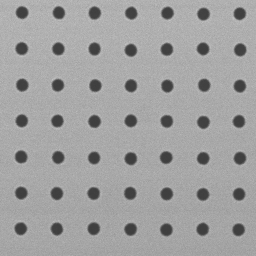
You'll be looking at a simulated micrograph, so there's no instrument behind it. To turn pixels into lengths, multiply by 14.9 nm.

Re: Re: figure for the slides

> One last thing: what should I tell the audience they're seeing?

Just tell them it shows a regular array of holes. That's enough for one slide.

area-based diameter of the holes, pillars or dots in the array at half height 0.195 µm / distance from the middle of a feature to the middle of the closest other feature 529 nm